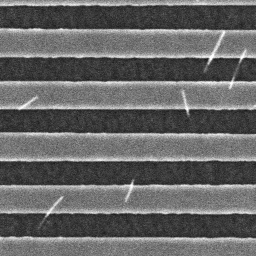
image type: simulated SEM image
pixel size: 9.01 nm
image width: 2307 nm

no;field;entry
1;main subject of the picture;lines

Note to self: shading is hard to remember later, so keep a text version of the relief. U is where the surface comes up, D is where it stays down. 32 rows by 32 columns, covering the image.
UUUUUUUUUUUUUUUUUUUUUUUUUUUUUUUU
DDDDDDDDDDDDDDDDDDDDDDDDDDDDDDDD
DDDDDDDDDDDDDDDDDDDDDDDDDDDDDDDD
DDDDDDDDDDDDDDDDDDDDDDDDDDDDDDDD
UUUUUUUUUUUUUUUUUUUUUUUUUUUUUUUU
UUUUUUUUUUUUUUUUUUUUUUUUUUUUUUUU
UUUUUUUUUUUUUUUUUUUUUUUUUUUUUUUU
DDDDDDDDDDDDDDDDDDDDDDDDDDDDDDDD
DDDDDDDDDDDDDDDDDDDDDDDDDDDDDDDD
DDDDDDDDDDDDDDDDDDDDDDDDDDDDDDDD
UUUUUUUUUUUUUUUUUUUUUUUUUUUUUUUU
UUUUUUUUUUUUUUUUUUUUUUUUUUUUUUUU
UUUUUUUUUUUUUUUUUUUUUUUUUUUUUUUU
UUUUUUUUUUUUUUUUUUUUUUUUUUUUUUUU
DDDDDDDDDDDDDDDDDDDDDDDDDDDDDDDD
DDDDDDDDDDDDDDDDDDDDDDDDDDDDDDDD
DDDDDDDDDDDDDDDDDDDDDDDDDDDDDDDD
UUUUUUUUUUUUUUUUUUUUUUUUUUUUUUUU
UUUUUUUUUUUUUUUUUUUUUUUUUUUUUUUU
UUUUUUUUUUUUUUUUUUUUUUUUUUUUUUUU
DDDDDDDDDDDDDDDDDDDDDDDDDDDDDDDD
DDDDDDDDDDDDDDDDDDDDDDDDDDDDDDDD
DDDDDDDDDDDDDDDDDDDDDDDDDDDDDDDD
UUUUUUUUUUUUUUUUUUUUUUUUUUUUUUUU
UUUUUUUUUUUUUUUUUUUUUUUUUUUUUUUU
UUUUUUUUUUUUUUUUUUUUUUUUUUUUUUUU
UUUUUUUUUUUUUUUUUUUUUUUUUUUUUUUU
DDDDDDDDDDDDDDDDDDDDDDDDDDDDDDDD
DDDDDDDDDDDDDDDDDDDDDDDDDDDDDDDD
DDDDDDDDDDDDDDDDDDDDDDDDDDDDDDDD
UUUUUUUUUUUUUUUUUUUUUUUUUUUUUUUU
UUUUUUUUUUUUUUUUUUUUUUUUUUUUUUUU